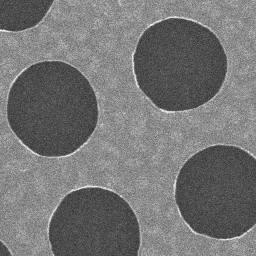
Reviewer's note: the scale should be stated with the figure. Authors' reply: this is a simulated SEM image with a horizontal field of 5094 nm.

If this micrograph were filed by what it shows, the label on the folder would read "holes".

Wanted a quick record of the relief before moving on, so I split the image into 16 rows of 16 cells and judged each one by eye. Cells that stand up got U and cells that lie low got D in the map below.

DDDUUUUUUUUUUUUU
DDUUUUUUUUDDUUUU
UUUUUUUUUDDDDDUU
UUUUUUUUDDDDDDUU
UDDDDUUUDDDDDDUU
UDDDDDUUUDDDDDUU
DDDDDDUUUUDDDUUU
UDDDDDUUUUUUUUUU
UDDDDDUUUUUUUUUU
UUDDDUUUUUUUDDDU
UUUUUUUUUUUDDDDD
UUUUUUUUUUUDDDDD
UUUUDDDDUUUDDDDD
UUUDDDDDUUUDDDDD
UUUDDDDDDUUUDDDU
UUUDDDDDDUUUUUUU